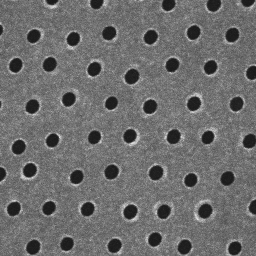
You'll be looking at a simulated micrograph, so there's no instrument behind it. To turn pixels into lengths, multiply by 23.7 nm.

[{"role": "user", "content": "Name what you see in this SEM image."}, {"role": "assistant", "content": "a regular array of holes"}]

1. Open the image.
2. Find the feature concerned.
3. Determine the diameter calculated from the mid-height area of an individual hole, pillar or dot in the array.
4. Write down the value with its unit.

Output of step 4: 345 nm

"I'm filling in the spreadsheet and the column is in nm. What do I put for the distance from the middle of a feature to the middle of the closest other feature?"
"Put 821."